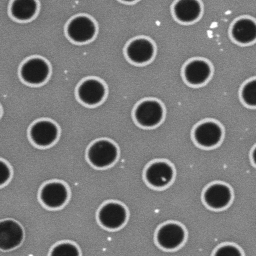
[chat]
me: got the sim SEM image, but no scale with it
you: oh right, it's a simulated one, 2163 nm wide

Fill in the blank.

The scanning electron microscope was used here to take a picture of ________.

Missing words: a regular array of raised bodies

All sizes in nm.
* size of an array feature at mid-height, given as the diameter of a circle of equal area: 255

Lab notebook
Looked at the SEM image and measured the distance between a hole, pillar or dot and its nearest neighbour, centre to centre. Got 61.5 pixels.